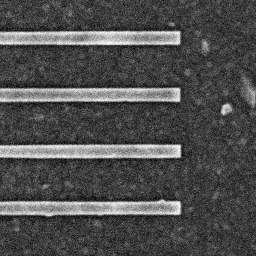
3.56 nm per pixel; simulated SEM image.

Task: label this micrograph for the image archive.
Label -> parallel lines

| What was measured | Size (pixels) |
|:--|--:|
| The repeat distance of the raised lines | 56.6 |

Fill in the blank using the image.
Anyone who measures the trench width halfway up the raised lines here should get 158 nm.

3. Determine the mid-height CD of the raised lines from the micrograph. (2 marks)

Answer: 45.4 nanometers